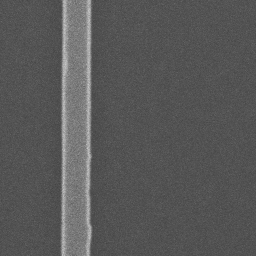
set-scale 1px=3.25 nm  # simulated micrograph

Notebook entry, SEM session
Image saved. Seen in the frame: one or a few lines or trenches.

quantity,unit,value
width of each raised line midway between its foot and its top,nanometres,83.3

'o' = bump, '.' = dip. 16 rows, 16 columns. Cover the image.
....oo..........
....oo..........
....oo..........
....oo..........
....oo..........
....oo..........
....oo..........
....oo..........
....oo..........
....oo..........
....oo..........
....oo..........
....oo..........
....oo..........
....oo..........
....oo..........